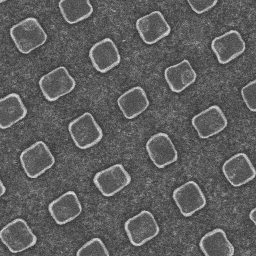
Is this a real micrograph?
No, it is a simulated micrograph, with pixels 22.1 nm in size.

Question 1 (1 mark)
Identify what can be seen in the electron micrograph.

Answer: a regular array of raised bodies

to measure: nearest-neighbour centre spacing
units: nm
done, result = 1220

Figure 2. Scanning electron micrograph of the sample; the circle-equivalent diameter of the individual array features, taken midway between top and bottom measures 659 nanometres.